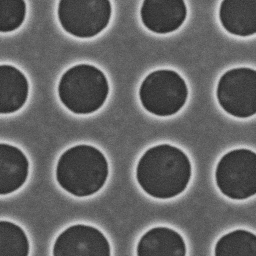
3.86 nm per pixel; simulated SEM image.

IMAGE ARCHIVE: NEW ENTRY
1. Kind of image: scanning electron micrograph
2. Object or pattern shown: holes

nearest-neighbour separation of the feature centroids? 79.6 pixels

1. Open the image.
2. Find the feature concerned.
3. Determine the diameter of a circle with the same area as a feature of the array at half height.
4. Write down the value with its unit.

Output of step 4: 198 nanometers